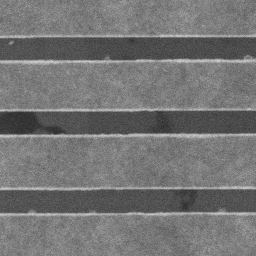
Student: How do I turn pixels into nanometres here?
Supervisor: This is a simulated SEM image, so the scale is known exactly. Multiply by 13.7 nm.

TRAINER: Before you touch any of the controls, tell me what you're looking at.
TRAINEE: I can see lines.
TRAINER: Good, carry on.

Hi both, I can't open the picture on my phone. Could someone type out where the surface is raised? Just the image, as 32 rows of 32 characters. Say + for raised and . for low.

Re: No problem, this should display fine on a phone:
++++++++++++++++++++++++++++++++
++++++++++++++++++++++++++++++++
++++++++++++++++++++++++++++++++
++++++++++++++++++++++++++++++++
++++++++++++++++++++++++++++++++
................................
................................
................................
++++++++++++++++++++++++++++++++
++++++++++++++++++++++++++++++++
++++++++++++++++++++++++++++++++
++++++++++++++++++++++++++++++++
++++++++++++++++++++++++++++++++
++++++++++++++++++++++++++++++++
................................
................................
................................
++++++++++++++++++++++++++++++++
++++++++++++++++++++++++++++++++
++++++++++++++++++++++++++++++++
++++++++++++++++++++++++++++++++
++++++++++++++++++++++++++++++++
++++++++++++++++++++++++++++++++
++++++++++++++++++++++++++++++++
................................
................................
................................
++++++++++++++++++++++++++++++++
++++++++++++++++++++++++++++++++
++++++++++++++++++++++++++++++++
++++++++++++++++++++++++++++++++
++++++++++++++++++++++++++++++++